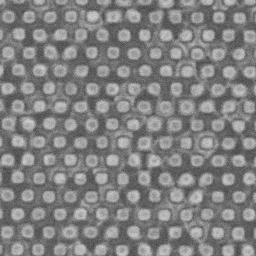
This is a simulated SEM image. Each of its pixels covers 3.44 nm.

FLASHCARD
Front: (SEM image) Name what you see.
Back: a regular array of raised bodies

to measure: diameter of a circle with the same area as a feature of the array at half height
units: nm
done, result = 38.2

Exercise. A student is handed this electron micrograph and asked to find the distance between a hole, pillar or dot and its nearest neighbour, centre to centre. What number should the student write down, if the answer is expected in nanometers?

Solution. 69.4